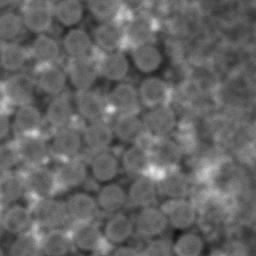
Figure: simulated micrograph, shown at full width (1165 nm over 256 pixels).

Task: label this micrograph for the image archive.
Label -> a regular array of raised bodies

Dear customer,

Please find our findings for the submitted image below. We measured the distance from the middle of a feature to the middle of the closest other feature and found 144 nanometres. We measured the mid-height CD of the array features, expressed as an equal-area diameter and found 25 px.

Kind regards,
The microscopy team